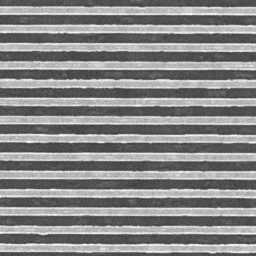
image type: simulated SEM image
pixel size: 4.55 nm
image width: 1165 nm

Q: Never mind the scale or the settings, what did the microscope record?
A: parallel lines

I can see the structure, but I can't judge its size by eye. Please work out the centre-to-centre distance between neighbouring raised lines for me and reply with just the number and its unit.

0.083 microns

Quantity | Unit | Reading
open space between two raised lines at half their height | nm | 51.7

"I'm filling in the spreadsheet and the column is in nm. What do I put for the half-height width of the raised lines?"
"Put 34.1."